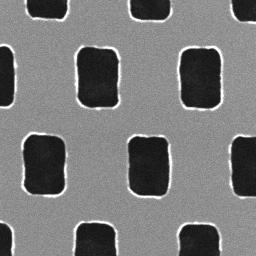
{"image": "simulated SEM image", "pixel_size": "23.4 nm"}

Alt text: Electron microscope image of holes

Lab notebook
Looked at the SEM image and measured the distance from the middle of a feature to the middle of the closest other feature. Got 2390 nanometres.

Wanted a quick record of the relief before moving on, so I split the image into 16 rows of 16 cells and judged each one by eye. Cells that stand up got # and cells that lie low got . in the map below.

##..####...####.
################
################
.####..####...##
.####..####...##
.####..####...##
.####..#####..##
################
##.#############
#...####...###..
##..####...###..
##..####...####.
################
################
.####..####...##
.####..####...##